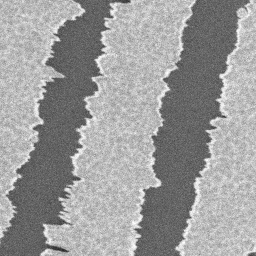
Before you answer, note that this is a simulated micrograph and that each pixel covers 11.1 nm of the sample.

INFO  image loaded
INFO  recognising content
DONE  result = one or a few lines or trenches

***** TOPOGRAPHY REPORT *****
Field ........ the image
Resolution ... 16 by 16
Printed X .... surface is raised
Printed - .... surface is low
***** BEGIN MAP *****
XXXXX--XXXXX----
XXXX---XXXX----X
XXX---XXXXX----X
XXX---XXXXX---XX
XXX---XXXXX---XX
XXX---XXXX----XX
XX---XXXXX----XX
XX----XXXX----XX
XX---XXXXX---XXX
XX---XXXXX---XXX
X----XXXXX---XXX
X----XXXXX--XXXX
X---XXXXX---XXXX
X---XXXXX---XXXX
---XXXXXX---XXXX
---XXXXX---XXXXX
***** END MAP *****